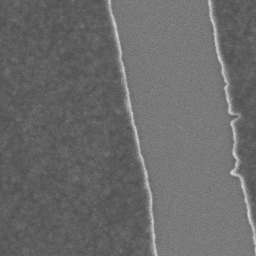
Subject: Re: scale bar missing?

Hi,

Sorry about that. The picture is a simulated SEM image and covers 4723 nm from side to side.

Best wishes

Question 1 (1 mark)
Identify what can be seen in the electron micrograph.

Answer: one or a few lines or trenches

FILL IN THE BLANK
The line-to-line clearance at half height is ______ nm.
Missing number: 1770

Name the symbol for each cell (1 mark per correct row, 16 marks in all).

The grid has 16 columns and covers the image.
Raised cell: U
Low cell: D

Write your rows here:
UUUUUUUDDDDDDUUU
UUUUUUUDDDDDDUUU
UUUUUUUDDDDDDUUU
UUUUUUUUDDDDDDUU
UUUUUUUUDDDDDDUU
UUUUUUUUDDDDDDUU
UUUUUUUUDDDDDDUU
UUUUUUUUDDDDDDDU
UUUUUUUUUDDDDDDU
UUUUUUUUUDDDDDDU
UUUUUUUUUDDDDDDU
UUUUUUUUUDDDDDDU
UUUUUUUUUDDDDDDU
UUUUUUUUUUDDDDDD
UUUUUUUUUUDDDDDD
UUUUUUUUUUDDDDDD